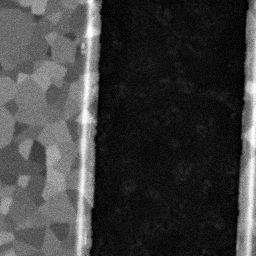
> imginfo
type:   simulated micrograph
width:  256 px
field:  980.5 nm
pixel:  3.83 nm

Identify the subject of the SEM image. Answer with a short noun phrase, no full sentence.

one or a few lines or trenches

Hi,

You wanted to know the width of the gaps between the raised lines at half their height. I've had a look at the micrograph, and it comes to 646 nm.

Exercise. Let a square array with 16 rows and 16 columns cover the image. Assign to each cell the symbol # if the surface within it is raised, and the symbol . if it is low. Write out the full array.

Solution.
######..........
######..........
######..........
######..........
#####...........
#####...........
#####...........
#####...........
#####...........
#####...........
#####...........
#####...........
#####...........
#####...........
#####...........
#####...........